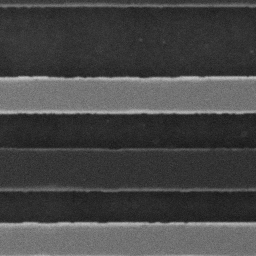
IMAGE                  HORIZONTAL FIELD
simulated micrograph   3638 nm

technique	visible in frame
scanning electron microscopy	lines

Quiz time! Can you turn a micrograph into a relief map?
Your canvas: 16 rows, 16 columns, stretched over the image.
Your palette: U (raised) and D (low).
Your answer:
DDDDDDDDDDDDDDDD
DDDDDDDDDDDDDDDD
DDDDDDDDDDDDDDDD
DDDDDDDDDDDDDDDD
DDDDDDDDDDDDDDDD
UUUUUUUUUUUUUUUU
UUUUUUUUUUUUUUUU
DDDDDDDDDDDDDDDD
DDDDDDDDDDDDDDDD
UUUUUUUUUUUUUUUU
UUUUUUUUUUUUUUUU
UUUUUUUUUUUUUUUU
DDDDDDDDDDDDDDDD
DDDDDDDDDDDDDDDD
UUUUUUUUUUUUUUUU
UUUUUUUUUUUUUUUU